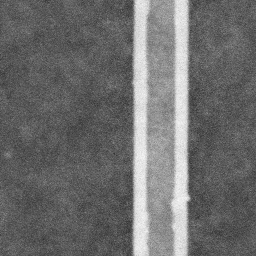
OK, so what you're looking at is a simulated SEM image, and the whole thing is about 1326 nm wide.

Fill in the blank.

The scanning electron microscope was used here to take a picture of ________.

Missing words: one or a few lines or trenches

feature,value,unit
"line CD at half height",40.3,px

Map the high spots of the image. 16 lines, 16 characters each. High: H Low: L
LLLLLLLLLHHLLLLL
LLLLLLLLLHHLLLLL
LLLLLLLLLHHLLLLL
LLLLLLLLLHHLLLLL
LLLLLLLLLHHLLLLL
LLLLLLLLLHHLLLLL
LLLLLLLLLHHLLLLL
LLLLLLLLLHHLLLLL
LLLLLLLLLHHLLLLL
LLLLLLLLLHHLLLLL
LLLLLLLLLHHLLLLL
LLLLLLLLLHHLLLLL
LLLLLLLLLHHLLLLL
LLLLLLLLLHHLLLLL
LLLLLLLLLHHLLLLL
LLLLLLLLLHHLLLLL